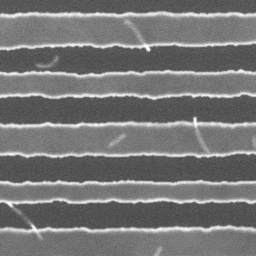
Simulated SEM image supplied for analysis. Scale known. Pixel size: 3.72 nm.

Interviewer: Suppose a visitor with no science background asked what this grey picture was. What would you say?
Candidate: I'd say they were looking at lines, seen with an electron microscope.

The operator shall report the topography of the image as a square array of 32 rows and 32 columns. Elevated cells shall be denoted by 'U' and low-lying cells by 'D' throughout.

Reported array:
DDDDDDDDDDDDDDDDDDDDDDDDDDDDDDDD
DDDDDDDDDDDDDDDDDDDDDDDDDDDDDDDD
UUUUUUUUUUUUUUUUUUUUUUUUUUUUUUUU
UUUUUUUUUUUUUUUUUUUUUUUUUUUUUUUU
UUUUUUUUUUUUUUUUUUUUUUUUUUUUUUUU
UUUUUUUUUUUUUUUUUUUUUUUUUUUUUUDD
DDDDDDDDDDDDDDDDDDDDDDDDDDDDDDDD
DDDDDDDDDDDDDDDDDDDDDDDDDDDDDDDD
DDDDDDDDDDDDDDDDDDDDDDDDDDDDDDDD
UUUUUUUUUUUUUUUUUUUUUUUUUUUUUUUU
UUUUUUUUUUUUUUUUUUUUUUUUUUUUUUUU
UUUUUUUUUUUUUUUUUUUUUUUUUUUUUUUU
DDDDDDDDDDDDDDDDDDDDDDDDDDDDDDDD
DDDDDDDDDDDDDDDDDDDDDDDDDDDDDDDD
DDDDDDDDDDDDDDDDDDDDDDDDDDDDDDDD
DDDDDUUDDDUUUUUUUUUUUUUUUUUUUUUU
UUUUUUUUUUUUUUUUUUUUUUUUUUUUUUUU
UUUUUUUUUUUUUUUUUUUUUUUUUUUUUUUU
UUUUUUUUUUUUUUUUUUUUUUUUUUUUUUUU
DDDUDDUUDDDDDDDDDDDDDDDDDUDDDDDD
DDDDDDDDDDDDDDDDDDDDDDDDDDDDDDDD
DDDDDDDDDDDDDDDDDDDDDDDDDDDDDDDD
DDDDDDDDDDDDDDDDDDDDDDDDDDDDDDDD
UUUUUUUUUUUUUUUUUUUUUUUUUUUUUUUU
UUUUUUUUUUUUUUUUUUUUUUUUUUUUUUUU
DUDDDDDDDDDDDDDDDDDDDDDDDDDDDDDD
DDDDDDDDDDDDDDDDDDDDDDDDDDDDDDDD
DDDDDDDDDDDDDDDDDDDDDDDDDDDDDDDD
DDDDUDUDDUUDDDDUUDDDUUUUUDUUUUUU
UUUUUUUUUUUUUUUUUUUUUUUUUUUUUUUU
UUUUUUUUUUUUUUUUUUUUUUUUUUUUUUUU
UUUUUUUUUUUUUUUUUUUUUUUUUUUUUUUU